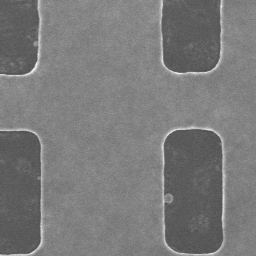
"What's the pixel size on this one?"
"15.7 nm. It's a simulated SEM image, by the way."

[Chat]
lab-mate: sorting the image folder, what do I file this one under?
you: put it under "holes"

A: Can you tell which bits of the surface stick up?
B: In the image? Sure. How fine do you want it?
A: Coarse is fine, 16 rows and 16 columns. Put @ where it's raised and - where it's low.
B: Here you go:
--@@@@@@@@----@@
--@@@@@@@@----@@
--@@@@@@@@----@@
--@@@@@@@@----@@
--@@@@@@@@@-@@@@
@@@@@@@@@@@@@@@@
@@@@@@@@@@@@@@@@
@@@@@@@@@@@@@@@@
--@@@@@@@@@---@@
---@@@@@@@----@@
---@@@@@@@----@@
---@@@@@@@----@@
---@@@@@@@----@@
---@@@@@@@----@@
---@@@@@@@----@@
--@@@@@@@@@---@@